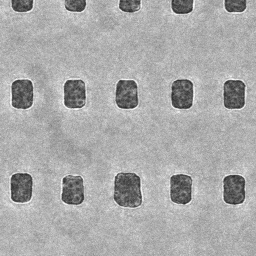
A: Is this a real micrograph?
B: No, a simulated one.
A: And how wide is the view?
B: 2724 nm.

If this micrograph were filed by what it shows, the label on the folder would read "a regular array of holes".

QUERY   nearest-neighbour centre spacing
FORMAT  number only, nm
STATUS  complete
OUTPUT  557